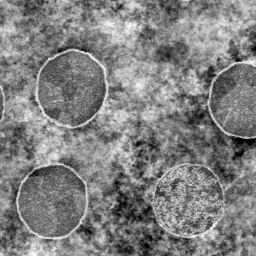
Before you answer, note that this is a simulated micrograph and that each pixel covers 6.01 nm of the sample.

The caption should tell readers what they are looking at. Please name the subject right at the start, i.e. raised bodies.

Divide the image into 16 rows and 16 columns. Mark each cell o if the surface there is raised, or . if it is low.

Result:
................
................
................
....oo..........
...oooo.......oo
..ooooo......ooo
..oooo.......ooo
...ooo.......ooo
...............o
................
..oo............
.oooo...........
.oooo...........
.oooo...........
..oo............
................